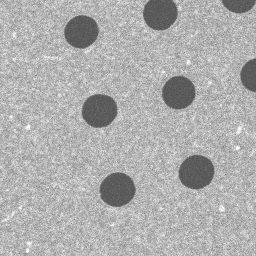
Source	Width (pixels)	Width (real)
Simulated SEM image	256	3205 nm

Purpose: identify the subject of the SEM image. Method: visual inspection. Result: holes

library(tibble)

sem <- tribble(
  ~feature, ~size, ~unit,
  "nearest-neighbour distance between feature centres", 1010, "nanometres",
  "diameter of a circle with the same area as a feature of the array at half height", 438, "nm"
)